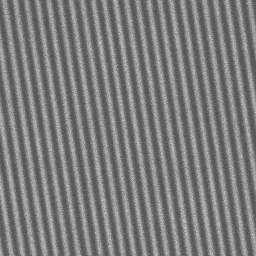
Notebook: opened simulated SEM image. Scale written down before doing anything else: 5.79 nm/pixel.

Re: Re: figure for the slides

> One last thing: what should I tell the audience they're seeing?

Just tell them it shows parallel lines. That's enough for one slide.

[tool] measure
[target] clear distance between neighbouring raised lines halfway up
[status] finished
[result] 36.5 nanometres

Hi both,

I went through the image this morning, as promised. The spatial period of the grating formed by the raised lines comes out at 63.6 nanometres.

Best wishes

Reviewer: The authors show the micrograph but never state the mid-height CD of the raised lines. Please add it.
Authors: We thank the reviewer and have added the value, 25.8 nanometres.